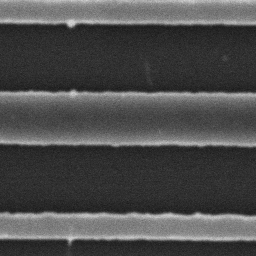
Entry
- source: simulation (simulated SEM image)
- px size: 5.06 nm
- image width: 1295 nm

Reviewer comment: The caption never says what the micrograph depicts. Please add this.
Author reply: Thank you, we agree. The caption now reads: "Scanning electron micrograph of lines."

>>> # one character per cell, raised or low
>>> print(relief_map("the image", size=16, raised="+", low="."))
++++++++++++++++
....+.....+++.++
................
................
................
................
++++++++++++++++
++++++++++++++++
++++++++++++++++
................
................
................
................
+++++++++++++++.
++++++++++++++++
................